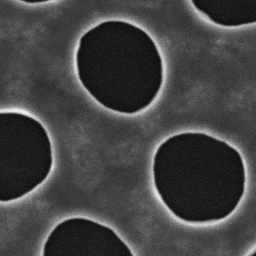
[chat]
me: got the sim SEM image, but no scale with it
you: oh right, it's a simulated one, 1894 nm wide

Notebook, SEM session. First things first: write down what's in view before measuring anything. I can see holes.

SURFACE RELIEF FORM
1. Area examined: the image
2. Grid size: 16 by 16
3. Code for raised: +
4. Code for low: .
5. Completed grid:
++++++++++++....
++++++..++++++.+
+++++....+++++++
+++++.....++++++
+++++.....++++++
+++++.....++++++
++++++...+++++++
..++++++++++++++
...++++++++..+++
...+++++++.....+
...+++++++.....+
..++++++++.....+
.+++++++++.....+
+++++++++++...++
+++....+++++++++
+++.....++++++++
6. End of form